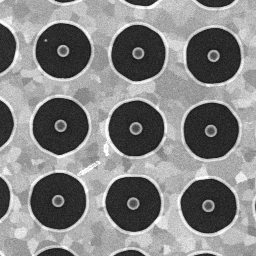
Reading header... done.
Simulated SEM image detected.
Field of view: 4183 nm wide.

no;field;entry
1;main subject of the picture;an array of small figures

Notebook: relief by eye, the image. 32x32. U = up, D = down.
UUUUUUUUUUUUUUUUDDDUUUUUUDDDDUUU
UUUUUUUUUUUUUUUUUUUUUUUUUUUUUUUU
UUUUUUUUUUUUUUUUUUUUUUUUUUUUUUUU
DUUUUUDDDDUUUUUDDDDUUUUUUUDDUUUU
DDUUUDDDDDDUUUUDDDDDUUUUDDDDDUUU
DDUUDDDDDDDUUUDDDDDDDUUDDDDDDDUU
DDUUDDDUDDDDUUDDDUDDDUUDDDDDDDUU
DDUUDDDDDDDUUUDDDDDDDUUDDDUDDDUU
DUUUUDDDDDDUUUDDDDDDUUUDDDDDDDUU
UUUUUUDDDUUUUUUDDDDUUUUUDDDDDUUU
UUUUUUUUUUUUUUUUUUUUUUUUUUDUUUUU
UUUUUUUUUUUUUUUUUUUUUUUUUUUUUUUU
UUUUUUDDDUUUUUUUUDUUUUUUUUUUUUUU
DUUUUDDDDDUUUUDDDDDUUUUUDDDDDUUU
DDUUDDDDDDDUUUDDDDDDUUUDDDDDDUUU
DDUUDDDUDDDUUUDDDDDDDUUDDDDDDDUU
DDUUDDDDDDDUUDDDDDDDDUUDDDUDDDUU
DUUUDDDDDDDUUUDDDDDDUUUDDDDDDDUU
UUUUUDDDDDUUUUDDDDDDUUUDDDDDDUUU
UUUUUUUUUUUUUUUUDDUUUUUUDDDDUUUU
UUUUUUUUUUUUUUUUUUUUUUUUUUUUUUUU
UUUUUUUDUUUUUUUUUUUUUUUUUUUUUUUU
DUUUUDDDDDUUUUDDDDDUUUUUUDDUUUUU
DUUUDDDDDDDUUUDDDDDDUUUDDDDDDUUU
DUUUDDDDDDDUUDDDDDDDUUUDDDDDDUUU
DUUUDDDUDDDUUDDDUDDDUUDDDDUDDDUU
DUUUDDDDDDDUUDDDDDDDUUUDDDDDDDUU
UUUUUDDDDDUUUUDDDDDDUUUDDDDDDUUU
UUUUUUDDDUUUUUUDDDDUUUUUDDDDUUUU
UUUUUUUUUUUUUUUUUUUUUUUUUUUUUUUU
UUUUUUUUUUUUUUUUUUUUUUUUUUUUUUUU
UUUUUDDDDUUUUUUDDDUUUUUUUUUUUUUU